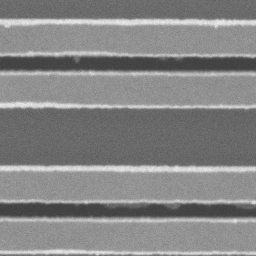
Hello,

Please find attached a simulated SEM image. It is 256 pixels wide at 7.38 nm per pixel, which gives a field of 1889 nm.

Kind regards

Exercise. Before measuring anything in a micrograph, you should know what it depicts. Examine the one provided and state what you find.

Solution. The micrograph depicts lines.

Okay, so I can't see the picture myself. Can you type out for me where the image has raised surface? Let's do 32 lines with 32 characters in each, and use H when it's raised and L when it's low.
LLLLLLLLLLLLLLLLLLLLLLLLLLLLLLLL
LLLLLLLLLLLLLLLLLLLLLLLLLLLLLLLL
LLLLLLLLLLLLLLLLLLLLLLLLLLLLLLLL
HHHHHHHHHHHHHHHHHHHHHHHHHHHHHHHH
HHHHHHHHHHHHHHHHHHHHHHHHHHHHHHHH
HHHHHHHHHHHHHHHHHHHHHHHHHHHHHHHH
HHHHHHHHHHHHHHHHHHHHHHHHHHHHHHHH
LLLLLLLLLLLLLLLLLLLLLLLLLLLLLLLL
LLLLLLLLLLLLLLLLLLLLLLLLLLLLLLLL
HHHHHHHHHHHHHHHHHHHHHHHHHHHHHHHH
HHHHHHHHHHHHHHHHHHHHHHHHHHHHHHHH
HHHHHHHHHHHHHHHHHHHHHHHHHHHHHHHH
HHHHHHHHHHHHHHHHHHHHHHHHHHHHHHHH
LLLLLLLLLLLLLLLLLLLLLLLLLLLLLLLL
LLLLLLLLLLLLLLLLLLLLLLLLLLLLLLLL
LLLLLLLLLLLLLLLLLLLLLLLLLLLLLLLL
LLLLLLLLLLLLLLLLLLLLLLLLLLLLLLLL
LLLLLLLLLLLLLLLLLLLLLLLLLLLLLLLL
LLLLLLLLLLLLLLLLLLLLLLLLLLLLLLLL
LLLLLLLLLLLLLLLLLLLLLLLLLLLLLLLL
LLLLLLLLLLLLLLLLLLLLLLLLLLLLLLLL
HHHHHHHHHHHHHHHHHHHHHHHHHHHHHHHH
HHHHHHHHHHHHHHHHHHHHHHHHHHHHHHHH
HHHHHHHHHHHHHHHHHHHHHHHHHHHHHHHH
HHHHHHHHHHHHHHHHHHHHHHHHHHHHHHHH
LLLLLLLLLLLLLLLLLLLLLLLLLLLLLLLL
LLLLLLLLLLLLLLLLLLLLLLLLLLLLLLLL
HHHHHHHHHHHHHHHHHHHHHHHHHHHHHHHH
HHHHHHHHHHHHHHHHHHHHHHHHHHHHHHHH
HHHHHHHHHHHHHHHHHHHHHHHHHHHHHHHH
HHHHHHHHHHHHHHHHHHHHHHHHHHHHHHHH
HHHHHHHHHHHHHHHHHHHHHHHHHHHHHHHH